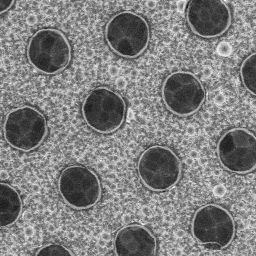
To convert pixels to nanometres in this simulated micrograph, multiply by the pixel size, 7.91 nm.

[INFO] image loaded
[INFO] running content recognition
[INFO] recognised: a regular array of raised bodies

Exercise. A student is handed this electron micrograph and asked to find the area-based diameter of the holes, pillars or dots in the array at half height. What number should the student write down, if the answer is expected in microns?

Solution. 0.34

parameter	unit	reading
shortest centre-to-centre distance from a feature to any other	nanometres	631